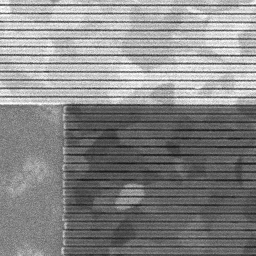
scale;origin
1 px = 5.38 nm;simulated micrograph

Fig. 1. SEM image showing parallel lines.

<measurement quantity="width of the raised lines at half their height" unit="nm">30.3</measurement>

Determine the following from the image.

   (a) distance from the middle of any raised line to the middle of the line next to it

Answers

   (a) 44.8 nm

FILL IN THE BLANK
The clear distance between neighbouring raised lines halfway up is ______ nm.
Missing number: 14.8